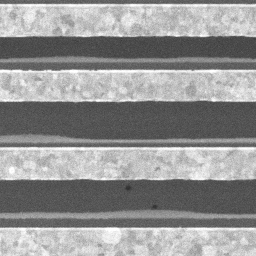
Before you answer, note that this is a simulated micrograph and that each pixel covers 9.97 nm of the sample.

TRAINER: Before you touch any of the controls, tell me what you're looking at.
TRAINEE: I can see lines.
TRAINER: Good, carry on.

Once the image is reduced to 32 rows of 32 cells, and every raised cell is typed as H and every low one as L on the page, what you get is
HHHHHHHHHHHHHHHHHHHHHHHHHHHHHHHH
HHHHHHHHHHHHHHHHHHHHHHHHHHHHHHHH
HHHHHHHHHHHHHHHHHHHHHHHHHHHHHHHH
HHHHHHHHHHHHHHHHHHHHHHHHHHHHHHHH
HHHHLHLHLHHHLHHHHHHLHHHHHHHLLLHH
LLLLLLLLLLLLLLLLLLLLLLLLLLLLLLLL
LLLLLLLLLLLLLLLLLLLLLLLLLLLLLLLL
LLLLLLLLLLLLLLLLLLLLLLLLLLLLLLLL
HHHHHHHHHHHHHHHHHHHHHHHHHHHHHHHH
HHHHHHHHHHHHHHHHHHHHHHHHHHHHHHHH
HHHHHHHHHHHHHHHHHHHHHHHHHHHHHHHH
HHHHHHHHHHHHHHHHHHHHHHHHHHHHHHHH
HHHHHHHHHHHHHHHHHLLLHHHHLLHHHHHH
LLLLLLLLLLLLLLLLLLLLLLLLLLLLLLLL
LLLLLLLLLLLLLLLLLLLLLLLLLLLLLLLL
LLLLLLLLLLLLLLLLLLLLLLLLLLLLLLLL
LLLLLLLLLLLLLLLLLLLLLLLLLLLLLLLL
LLLLLLLLLLLLLLLLLLLLLLLLLLLLLLLL
HHHHHHHHHHHHHHHHHHHHHHHHHHHHHHHH
HHHHHHHHHHHHHHHHHHHHHHHHHHHHHHHH
HHHHHHHHHHHHHHHHHHHHHHHHHHHHHHHH
HHHHHHHHHHHHHHHHHHHHHHHHHHHHHHHH
LLLLLLLLLLLLLLLLLLLLLLLLLLLLLLLL
LLLLLLLLLLLLLLLLLLLLLLLLLLLLLLLL
LLLLLLLLLLLLLLLLLLLLLLLLLLLLLLLL
LLLLLLLLLLLLLLLLLLLLLLLLLLLLLLLL
LLLLLLLLLLLLLLLLLLLLLLLLLLLLLLLL
HHHHHHHHHHHHHHHHHHHHHHHHHHHHHHHH
HHHHHHHHHHHHHHHHHHHHHHHHHHHHHHHH
HHHHHHHHHHHHHHHHHHHHHHHHHHHHHHHH
HHHHHHHHHHHHHHHHHHHHHHHHHHHHHHHH
HHHHHHHHHHHHHHHHHHHHHHHHHHHHHHHH